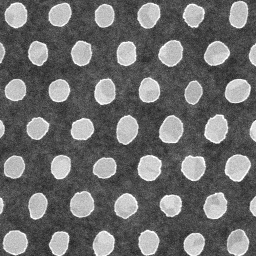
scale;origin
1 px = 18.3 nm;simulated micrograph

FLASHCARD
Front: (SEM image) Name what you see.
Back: a regular array of raised bodies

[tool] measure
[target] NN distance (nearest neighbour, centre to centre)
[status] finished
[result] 790 nm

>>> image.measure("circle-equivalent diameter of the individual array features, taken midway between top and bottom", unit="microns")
0.408